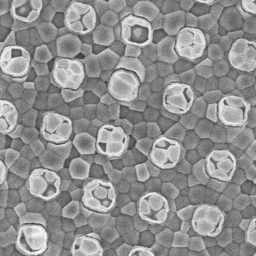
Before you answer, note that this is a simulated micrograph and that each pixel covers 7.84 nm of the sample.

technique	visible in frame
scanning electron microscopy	a regular array of raised bodies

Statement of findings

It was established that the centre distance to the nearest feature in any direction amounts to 0.297 um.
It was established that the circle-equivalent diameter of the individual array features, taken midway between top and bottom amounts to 0.218 micrometres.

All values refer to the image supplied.